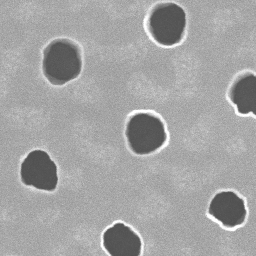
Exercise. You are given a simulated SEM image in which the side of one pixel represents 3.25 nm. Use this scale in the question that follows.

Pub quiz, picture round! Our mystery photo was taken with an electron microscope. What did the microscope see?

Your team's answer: holes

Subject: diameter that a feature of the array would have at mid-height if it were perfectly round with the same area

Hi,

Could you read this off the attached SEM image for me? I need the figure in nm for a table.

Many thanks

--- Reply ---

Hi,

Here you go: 125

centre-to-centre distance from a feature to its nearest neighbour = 359 nanometres